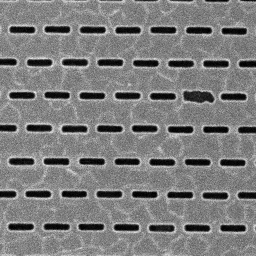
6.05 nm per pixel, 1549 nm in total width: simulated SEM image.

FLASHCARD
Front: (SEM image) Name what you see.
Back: a regular array of holes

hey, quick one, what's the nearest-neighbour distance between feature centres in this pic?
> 212 nm